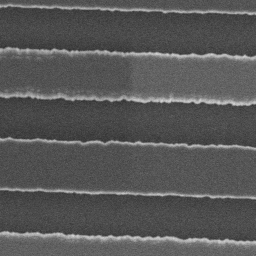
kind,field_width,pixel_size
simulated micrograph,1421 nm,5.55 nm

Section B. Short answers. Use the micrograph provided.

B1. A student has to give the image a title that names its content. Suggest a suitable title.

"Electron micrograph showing lines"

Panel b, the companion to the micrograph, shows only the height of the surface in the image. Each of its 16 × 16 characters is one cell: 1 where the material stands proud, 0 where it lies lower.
0001111111111111
0000000000000000
0000000000000000
1111111111111100
1111111111111111
1111111111111111
0000000000000011
0000000000000000
0000000000000000
1111111111111111
1111111111111111
1111111111111111
0000000000000000
0000000000000000
0000000000000000
1111111111111111